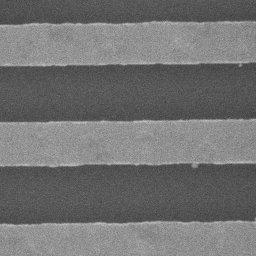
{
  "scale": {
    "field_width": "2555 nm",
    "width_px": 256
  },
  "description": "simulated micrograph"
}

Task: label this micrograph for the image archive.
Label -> lines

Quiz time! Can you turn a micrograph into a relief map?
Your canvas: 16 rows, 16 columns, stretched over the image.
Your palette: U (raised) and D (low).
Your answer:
DDDDDDDDDDDDDDDD
DDUUUUUUUUUUUUUU
UUUUUUUUUUUUUUUU
UUUUUUUUUUUUUUUU
DDDDDDDDDDDDDDDD
DDDDDDDDDDDDDDDD
DDDDDDDDDDDDDDDD
DDDDDDDDDDDDDDDU
UUUUUUUUUUUUUUUU
UUUUUUUUUUUUUUUU
DDDDDDDDDDDDDDDD
DDDDDDDDDDDDDDDD
DDDDDDDDDDDDDDDD
DDDDDDDDDDDDDDDD
UUUUUUUUUUUUUUUU
UUUUUUUUUUUUUUUU